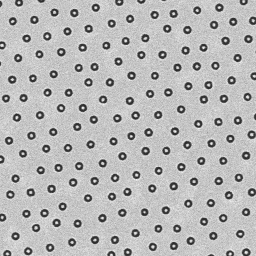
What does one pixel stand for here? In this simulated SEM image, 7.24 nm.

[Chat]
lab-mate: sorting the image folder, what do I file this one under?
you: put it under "a regular array of ring-shaped grooves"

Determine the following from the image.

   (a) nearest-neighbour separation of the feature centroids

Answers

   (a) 0.139 microns